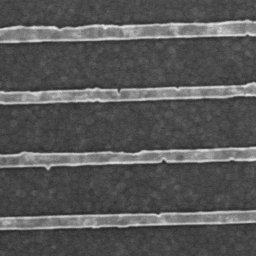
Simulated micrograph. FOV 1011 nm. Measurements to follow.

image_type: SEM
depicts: one or a few lines or trenches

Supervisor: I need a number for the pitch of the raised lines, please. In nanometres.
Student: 248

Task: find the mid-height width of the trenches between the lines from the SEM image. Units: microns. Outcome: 0.201